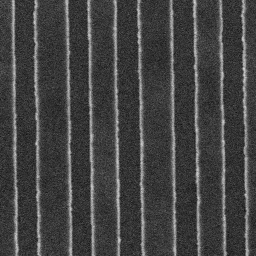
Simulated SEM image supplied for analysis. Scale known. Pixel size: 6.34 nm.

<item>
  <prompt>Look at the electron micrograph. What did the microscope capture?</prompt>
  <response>lines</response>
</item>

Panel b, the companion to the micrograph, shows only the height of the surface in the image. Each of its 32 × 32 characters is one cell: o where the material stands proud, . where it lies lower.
oo..oooo...ooo...oooo...oooo..oo
oo..oooo...ooo...ooooo..oooo..oo
oo..ooooo..ooo...ooooo..oooo..oo
oo..ooooo..ooo...ooooo..oooo..oo
oo..ooooo..ooo...ooooo..oooo..oo
oo..ooooo..ooo...ooooo..oooo..oo
oo..ooooo..ooo...ooooo..oooo..oo
oo..ooooo..ooo...ooooo..oooo..oo
oo..ooooo..ooo...ooooo..oooo..oo
oo..ooooo..ooo...ooooo..oooo..oo
oo..ooooo..ooo....oooo..oooo..oo
oo..ooooo..oooo...oooo..oooo..oo
oo...oooo..oooo...oooo..oooo...o
oo...oooo..oooo...oooo..oooo...o
oo...oooo..oooo...oooo..oooo...o
oo...oooo..oooo...oooo..oooo...o
oo...oooo..oooo...oooo..oooo...o
oo...oooo..oooo...oooo...ooo...o
oo...oooo..oooo...oooo...ooo...o
oo...oooo..oooo...oooo...ooo...o
oo...oooo..oooo...oooo...ooo...o
oo...oooo..oooo...oooo...ooo...o
oo...oooo..oooo...oooo...ooo...o
oo...oooo..oooo...oooo...ooo...o
oo...oooo..oooo...oooo...ooo...o
oo...oooo..oooo...oooo...ooo...o
oo...oooo..oooo...oooo...ooo...o
oo...oooo..oooo...oooo...ooo...o
oo...oooo..oooo...oooo...ooo...o
oo...oooo...ooo...oooo...ooo...o
oo...oooo...ooo...oooo...ooo...o
oo...oooo...ooo...oooo...ooo...o